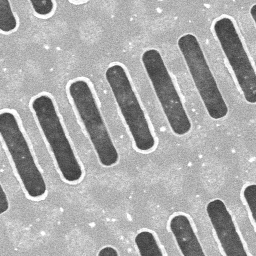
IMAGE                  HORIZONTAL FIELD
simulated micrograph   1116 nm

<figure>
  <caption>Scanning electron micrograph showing holes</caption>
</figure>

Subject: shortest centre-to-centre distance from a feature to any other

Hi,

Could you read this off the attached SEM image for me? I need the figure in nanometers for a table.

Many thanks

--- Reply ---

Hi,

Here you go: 172